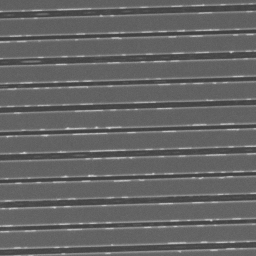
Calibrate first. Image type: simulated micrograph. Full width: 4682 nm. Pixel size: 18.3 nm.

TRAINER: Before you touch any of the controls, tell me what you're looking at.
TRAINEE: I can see parallel lines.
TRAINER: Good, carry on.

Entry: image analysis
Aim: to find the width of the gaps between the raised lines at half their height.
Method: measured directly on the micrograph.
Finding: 100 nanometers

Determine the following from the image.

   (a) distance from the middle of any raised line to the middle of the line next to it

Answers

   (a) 432 nanometers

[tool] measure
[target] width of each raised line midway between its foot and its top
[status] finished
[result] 338 nm